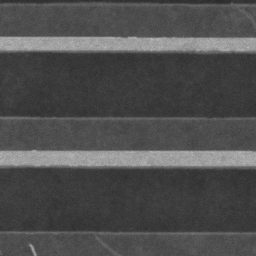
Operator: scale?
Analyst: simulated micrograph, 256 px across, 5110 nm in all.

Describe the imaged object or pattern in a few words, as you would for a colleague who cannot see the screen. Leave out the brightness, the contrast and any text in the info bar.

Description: lines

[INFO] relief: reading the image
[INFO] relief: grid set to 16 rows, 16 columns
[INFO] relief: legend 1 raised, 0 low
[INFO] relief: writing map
1111111111111111
1111111111111111
1111111111111111
0000000000000000
0000000000000000
0000000000000000
0000000000000000
1111111111111111
1111111111111111
1111111111111111
0000000000000000
0000000000000000
0000000000000000
0000000000000000
0000000000000000
1111111111111111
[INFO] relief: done